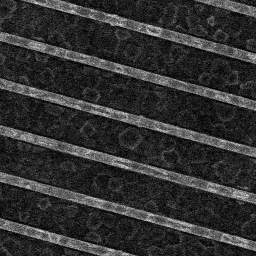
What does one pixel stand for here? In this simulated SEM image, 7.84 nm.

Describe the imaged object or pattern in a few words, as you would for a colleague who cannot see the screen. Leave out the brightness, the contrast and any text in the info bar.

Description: parallel lines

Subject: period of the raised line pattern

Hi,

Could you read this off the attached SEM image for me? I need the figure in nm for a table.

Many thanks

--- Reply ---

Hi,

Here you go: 355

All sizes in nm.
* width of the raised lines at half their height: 71.9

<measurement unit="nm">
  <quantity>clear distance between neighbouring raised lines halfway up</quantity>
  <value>286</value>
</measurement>